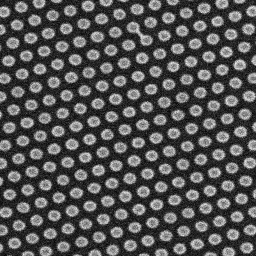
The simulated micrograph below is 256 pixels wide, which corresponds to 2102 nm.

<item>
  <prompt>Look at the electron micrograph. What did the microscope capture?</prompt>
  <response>a regular array of raised bodies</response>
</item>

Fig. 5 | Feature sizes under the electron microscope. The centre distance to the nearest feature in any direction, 150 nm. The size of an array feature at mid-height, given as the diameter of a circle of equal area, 0.0869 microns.